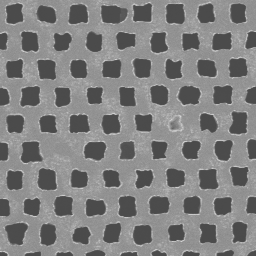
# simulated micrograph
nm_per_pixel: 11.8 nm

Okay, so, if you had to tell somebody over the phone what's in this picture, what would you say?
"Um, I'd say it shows a regular array of holes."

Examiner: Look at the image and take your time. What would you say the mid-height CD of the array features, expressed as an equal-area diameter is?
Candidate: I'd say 225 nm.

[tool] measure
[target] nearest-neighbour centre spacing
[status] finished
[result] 0.365 um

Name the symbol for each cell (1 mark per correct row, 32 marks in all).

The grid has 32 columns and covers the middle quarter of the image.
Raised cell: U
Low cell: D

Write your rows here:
UDDDDDUUUUDDDDUUUUDDDDUUUDDDDUUU
UDDDDDUUUUDDDDUUUUDDDDUUUDDDDUUU
UUDDDDUUUUDDDDUUUUDDDDUUUUDDDUUU
UUUDUUUUUUUUUUUUUUUDDUUUUUDDUUUU
UUUUUUUUUUUUUUUUUUUUUUUUUUUUUUUU
UUUUUUUUUUUUUUUUUUUUUUUDDUUUUUDD
DDUUUUDDDDUUUUDDDDUUUDDDDDUUUDDD
DDUUUUDDDDUUUUDDDDUUUUDDDDUUUDDD
DDUUUUDDDUUUUUDDDDUUUUDDDDUUUDDD
DDUUUUDDDUUUUUDDDDUUUUDDDDUUUDDD
UUUUUUUUUUUUUUUDDUUUUUUUUUUUUUUU
UUUUUUUUUUUUUUUUUUUUUUUUUUUUUUUU
UUUUUUUUUUUUUUUUUUUUUUUUUUUUUUUU
UUDDDDUUUUDDDDUUUUDDDDUUUUUUUUUU
UDDDDDUUUUDDDDUUUUDDDDUUUUUUUUUU
UDDDDDUUUUDDDDUUUUDDDDUUUUUUUUUU
UDDDDDUUUUDDDDUUUUDDDDUUUUUUUUUU
UUUUUUUUUUDUUUUUUUUUUUUUUUUUUUUU
UUUUUUUUUUUUUUUUUUUUUUUUUUUUUUUU
UUUUUUUUUDUUUUUDDUUUUUDDDUUUUUUD
UUUUUDDDDDDUUUDDDDUUUUDDDDUUUUDD
UUUUUDDDDDUUUUDDDDUUUUDDDDUUUDDD
UUUUUDDDDDUUUUDDDDUUUUDDDUUUUUDD
UUUUUDDDDDUUUUDDDUUUUUUDDUUUUUUD
UUUUUUUUUUUUUUUUUUUUUUUUUUUUUUUU
UUUUUUUUUUUUUUUUUUUUUUUUUUUUUUUU
UUUUUUUUUUUUUUUUUUUUUUUUUUDDUUUU
UUDDDDUUUUDDDDUUUUDDDDUUUUDDDDUU
UUDDDDUUUUDDDDUUUUDDDDUUUUDDDDUU
UUDDDDUUUUDDDDUUUUDDDDUUUUDDDDUU
UUDDDUUUUUDDDDUUUUDDDUUUUUDDUUUU
UUUUUUUUUUUUUUUUUUUUUUUUUUUUUUUU